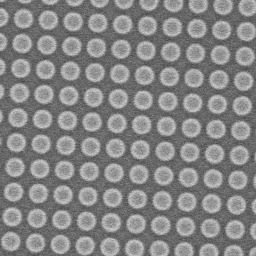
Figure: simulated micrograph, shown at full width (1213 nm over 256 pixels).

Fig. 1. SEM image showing an array of small figures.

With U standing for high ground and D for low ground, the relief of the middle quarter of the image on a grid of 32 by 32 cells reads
UUUDDDUUUDDDDUUDDDDDDDDDDDDDDDDD
UUUUDDUUUUDDUUUUDDUUUUDDDUUUDDDD
UUUUDUUUUUDDUUUUDDUUUUDDUUUUDDDU
UUUDDDUUUDDDUUUUDDUUUUDDUUUUDDUU
DDDDDDDDDDDDDUUDDDDUUUDDUUUUDDUU
DDDDDDDDDDDDDDDDDDDDDDDDDDDDDDDU
UUUDDDUUUDDDDDDDDDDDDDDDDDDDDDDD
UUUDDUUUUDDDUUUDDDUUUDDDDUUDDDDD
UUUDDUUUUUDUUUUUDDUUUUDDUUUUDDUU
UUUDDUUUUDDUUUUUDDUUUUDDUUUUDDUU
DDDDDDDUDDDDUUUDDDUUUDDDUUUUDDUU
DDDDDDDDDDDDDDDDDDDDDDDDDUUDDDDU
UUDDDDUUDDDDDDDDDDDDDDDDDDDDDDDD
UUUDDUUUUDDUUUUDDDUUUDDDDUDDDDDD
UUUDDUUUUDDUUUUDDUUUUDDDUUUUDDUU
UUUDDUUUUDDUUUUDDUUUUUDUUUUUDDUU
DDDDDDUUDDDDUUUDDDUUUDDDUUUUDDUU
DDDDDDDDDDDDDDDDDDDDDDDDUUUDDDUU
UUDDDDDDDDDDDDDDDDDDDDDDDDDDDDDD
UUDDDUUUUDDUUUDDDDUUDDDDDDDDDDDD
UUUDDUUUUDDUUUUDDUUUUDDUUUUDDDUU
UUDDDUUUUDDUUUUDDUUUUDDUUUUDDUUU
UDDDDUUUDDDUUUUDDUUUUDDUUUUDDUUU
DDDDDDDDDDDDDDDDDDUUDDDDUUUDDDUU
UDDDDDDDDDDDDDDDDDDDDDDDDDDDDDDD
UUDDDUUUDDDUUUDDDDUDDDDDDDDDDDDD
UUDDUUUUDDUUUUUDDUUUUDDUUUUDDDUU
UUDDUUUUDDUUUUUDUUUUUDDUUUUDDUUU
UDDDDUUUDDDUUUDDDUUUUDDUUUUDDUUU
DDDDDDDDDDDDDDDDDUUUDDDUUUDDDUUU
DDDDDDDDDDDDDDDDDDDDDDDDDDDDDDUU
UDDDUUUDDDDUUDDDDDDDDDDDDDDDDDDD